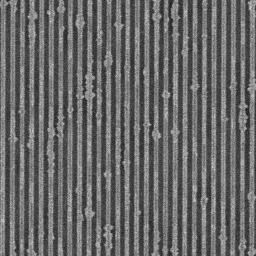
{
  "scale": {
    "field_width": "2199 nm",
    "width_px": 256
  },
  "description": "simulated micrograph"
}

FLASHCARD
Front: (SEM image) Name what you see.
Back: parallel lines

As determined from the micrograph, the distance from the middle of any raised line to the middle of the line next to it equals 0.0822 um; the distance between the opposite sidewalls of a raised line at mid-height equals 25.8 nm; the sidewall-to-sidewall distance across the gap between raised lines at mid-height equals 50.4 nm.